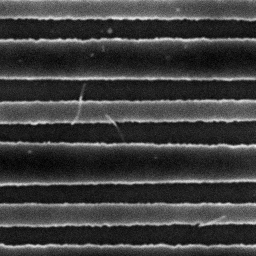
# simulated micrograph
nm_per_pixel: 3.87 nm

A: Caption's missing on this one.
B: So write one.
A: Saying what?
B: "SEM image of lines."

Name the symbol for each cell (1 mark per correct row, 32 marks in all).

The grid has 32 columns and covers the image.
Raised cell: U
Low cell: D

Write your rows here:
UUUUUUUUUUUUUUUUUUUUUUUUUUUUUUUU
UUUUUUUUUUUUUUUUUUUUUUUUUUUUUUUU
DDDDDDDDDDDDDDDDDDDDDDDDDDDDDDUU
DDDDDDDDDDDDDDDDDDDDDDDDDDDDDDDD
DDDDDDDDDDDDDDDDDDDDDDDDDDDDDDDD
UUUUUUUUUUUUUUUUUUUUUUUUUUUUUUUU
UUUUUUUUUUUUUUUUUUUUUUUUUUUUUUUU
UUUUUUUUUUUUUUUUUUUUUUUUUUUUUUUU
UUUUUUUUUUUUUUUUUUUUUUUUUUUUUUUU
UUUUUUUUUUUUUUUUUUUUUUUUUUUUUUUU
DDDDDDDDDDDDDDDDDDDDDDDDDDDDDDDD
DDDDDDDDDDDDDDDDDDDDDDDDDDDDDDDD
DDDDDDDDDDDDDDDDDDDDDDDDDDDDDDDD
UUUUUUUUUUUUUUUUUUUUUUUUUUUUUUUU
UUUUUUUUUUUUUUUUUUUUUUUUUUUUUUUU
DDDDUDDDDDDDDDDDDDDDDDDDDDDDDDDD
DDDDDDDDDDDDDDDDDDDDDDDDDDDDDDDD
DDDDDDDDDDDDDDDDDDDDDDDDDDDDDDDD
UUUUUUUUUUUUUUUUUUUUUUUUUUUUUUUU
UUUUUUUUUUUUUUUUUUUUUUUUUUUUUUUU
UUUUUUUUUUUUUUUUUUUUUUUUUUUUUUUU
UUUUUUUUUUUUUUUUUUUUUUUUUUUUUUUU
UUUUUUUUUUUUUUUUUUUUUUUUUUUUUUUU
DDDDDDDDDDDDDDDDDDDDDDDDDDDDDDDD
DDDDDDDDDDDDDDDDDDDDDDDDDDDDDDDD
DDDUUDDDUDUDUUUUDDUUUDDUDUUUUDDU
UUUUUUUUUUUUUUUUUUUUUUUUUUUUUUUU
UUUUUUUUUUUUUUUUUUUUUUUUUUUUUUUU
DDDDDDDDDDDDDDDDDDDDDDDDDDDDDDDD
DDDDDDDDDDDDDDDDDDDDDDDDDDDDDDDD
DDDDDDDDDDDDDDDDDDDDDDDDDDDDDDDD
UUUUUUUUUUUUUUUUUUUUUUUUUUUUUUUU